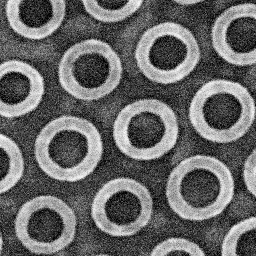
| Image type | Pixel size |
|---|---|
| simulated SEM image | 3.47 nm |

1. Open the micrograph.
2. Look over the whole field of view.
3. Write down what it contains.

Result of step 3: a regular array of ring-shaped raised bodies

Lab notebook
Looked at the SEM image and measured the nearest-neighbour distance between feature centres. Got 0.272 microns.